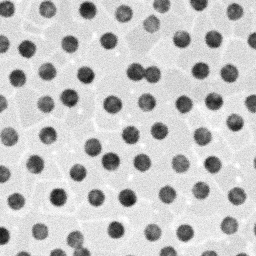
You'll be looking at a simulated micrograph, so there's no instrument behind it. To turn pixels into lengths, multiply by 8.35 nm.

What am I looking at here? a regular array of holes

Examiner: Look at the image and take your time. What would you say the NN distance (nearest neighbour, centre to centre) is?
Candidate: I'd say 253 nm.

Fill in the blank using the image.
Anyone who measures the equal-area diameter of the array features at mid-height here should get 159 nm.